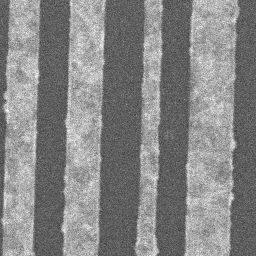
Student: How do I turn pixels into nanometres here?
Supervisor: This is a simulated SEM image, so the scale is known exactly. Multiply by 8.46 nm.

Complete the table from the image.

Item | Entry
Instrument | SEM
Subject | one or a few lines or trenches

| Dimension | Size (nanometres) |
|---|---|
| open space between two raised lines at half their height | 268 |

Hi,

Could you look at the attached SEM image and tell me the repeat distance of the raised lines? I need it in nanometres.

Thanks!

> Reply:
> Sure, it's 536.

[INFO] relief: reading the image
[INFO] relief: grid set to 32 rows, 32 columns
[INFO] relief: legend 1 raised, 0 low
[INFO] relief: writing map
01111000011110000011000011111100
01111000011110000011000011111100
01111000011110000011000011111000
01111000011110000011000011111000
01111000011110000011000011111000
01111000011110000011000011111000
01111000011110000011000011111000
01111000011110000011000011111000
01111000011110000011000011111000
01111000011110000011000011111000
01111000011110000011000011111000
01111000011110000011000011111000
01110000011110000011000011111000
11110000011110000011000011111000
01110000111110000011000011111000
01111000111110000011000011111000
01111000111110000011000011111000
01110000111100000011000011111000
01110000111100000011000011111000
01110000111100000011000011111000
01110000111110000011000111111000
01110000111100000011000111111000
01110000111100000011000111111000
01110000111100000011000011111000
01110000111100000011000111111000
11110000111100000110000111111000
11110000111100000110000111111000
11110000111100000110000111111000
01110000111100000110000111111000
11110000111100000110000111111000
11110000111100000111000111111000
11110000111100000111000111111000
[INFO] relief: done